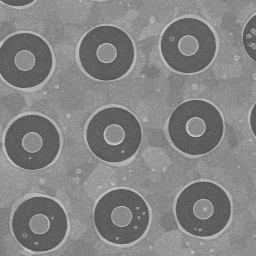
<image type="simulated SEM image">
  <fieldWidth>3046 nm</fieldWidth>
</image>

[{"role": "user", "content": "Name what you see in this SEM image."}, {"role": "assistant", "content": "an array of small figures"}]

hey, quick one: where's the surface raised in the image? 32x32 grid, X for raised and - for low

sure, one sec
X---XXXXXXXXXXXXXXXXXXXXXXXXXXXX
XXXXXXXXXXXXXXXXXXXXXXXXXXXXXXXX
XXXXXXXXXXXXXXXXXXXXXX---XXXXXX-
XXXXXXXXXXXX---XXXXXX-----XXXXX-
X----XXXXXX-----XXXX-------XXX--
------XXXX---X---XXX--XXX--XXX--
---X---XXX--XX---XXX---X---XXXX-
--XX---XXX---X---XXX-------XXXXX
--XX---XXX------XXXXX-----XXXXXX
------XXXXX----XXXXXXXXXXXXXXXXX
X----XXXXXXXXXXXXXXXXXXXXXXXXXXX
XXXXXXXXXXXXXXXXXXXXXXXXXXXXXXXX
XXXXXXXXXXXXXXXXXXXXXXXX-XXXXXXX
XXXXXXXXXXXXX--XXXXXXX-----XXXX-
XX----XXXXXX-----XXXX-------XXX-
X------XXXX------XXXX--XXX--XXX-
X------XXXX--XX---XXX---X---XXXX
---XX---XXX--XX---XXX-------XXXX
X--XX---XXX------XXXXX-----XXXXX
X------XXXXX-----XXXXXXX-XXXXXXX
XX----XXXXXXXX-XXXXXXXXXXXXXXXXX
XXXXXXXXXXXXXXXXXXXXXXXXXXXXXXXX
XXXXXXXXXXXXXXXXXXXXXXXXXXXXXXXX
XXXXXXXXXXXXXXXXXXXXXXX-----XXXX
XXXX--XXXXXXX-----XXXX-------XXX
XX------XXXX------XXXX--XX---XXX
XX------XXXX--XX---XXX--XXX--XXX
X---XX--XXXX--XX---XXX-------XXX
X---XX---XXX------XXXXX-----XXXX
XX------XXXXX-----XXXXXX---XXXXX
XX------XXXXXX---XXXXXXXXXXXXXXX
XXXX--XXXXXXXXXXXXXXXXXXXXXXXXXX